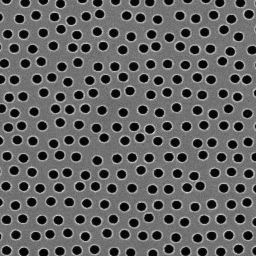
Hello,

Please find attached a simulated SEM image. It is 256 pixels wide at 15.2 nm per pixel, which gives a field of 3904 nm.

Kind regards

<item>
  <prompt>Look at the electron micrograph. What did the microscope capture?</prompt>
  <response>a regular array of holes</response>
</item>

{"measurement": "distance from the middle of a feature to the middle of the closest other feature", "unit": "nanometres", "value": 232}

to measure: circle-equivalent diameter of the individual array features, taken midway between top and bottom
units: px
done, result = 9.24